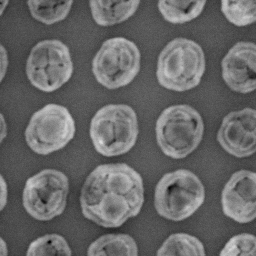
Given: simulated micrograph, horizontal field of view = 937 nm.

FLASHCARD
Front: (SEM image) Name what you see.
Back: a regular array of raised bodies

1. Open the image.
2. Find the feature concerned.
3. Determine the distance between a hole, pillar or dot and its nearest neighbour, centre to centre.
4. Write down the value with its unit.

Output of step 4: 236 nm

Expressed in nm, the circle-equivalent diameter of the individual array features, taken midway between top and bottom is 166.